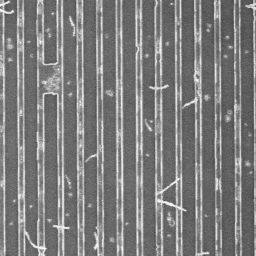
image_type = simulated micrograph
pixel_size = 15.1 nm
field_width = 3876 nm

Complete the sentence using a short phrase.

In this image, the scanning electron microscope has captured parallel lines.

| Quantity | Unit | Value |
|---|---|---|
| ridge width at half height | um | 0.0833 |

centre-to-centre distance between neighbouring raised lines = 298 nanometres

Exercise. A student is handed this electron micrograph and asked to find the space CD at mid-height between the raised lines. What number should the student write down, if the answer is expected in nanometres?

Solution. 204